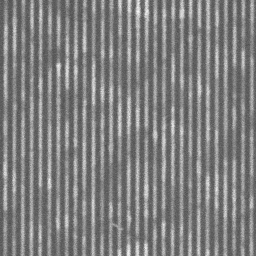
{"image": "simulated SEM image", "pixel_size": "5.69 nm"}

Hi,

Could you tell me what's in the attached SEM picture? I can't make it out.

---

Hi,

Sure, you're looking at parallel lines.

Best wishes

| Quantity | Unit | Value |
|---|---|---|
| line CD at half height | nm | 14.9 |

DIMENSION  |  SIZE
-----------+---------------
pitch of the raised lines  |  50 nanometres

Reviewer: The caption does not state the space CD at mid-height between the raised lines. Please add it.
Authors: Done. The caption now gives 34.1 nanometers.